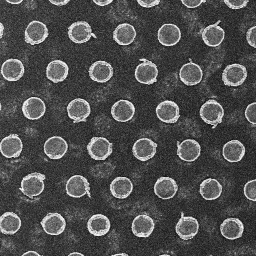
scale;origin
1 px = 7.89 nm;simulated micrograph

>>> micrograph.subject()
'a regular array of raised bodies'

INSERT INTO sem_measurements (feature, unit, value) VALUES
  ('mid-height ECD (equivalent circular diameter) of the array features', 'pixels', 22.2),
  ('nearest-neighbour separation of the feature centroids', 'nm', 344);